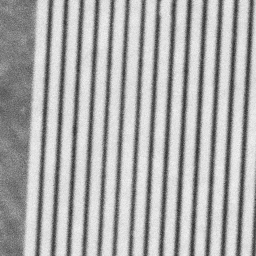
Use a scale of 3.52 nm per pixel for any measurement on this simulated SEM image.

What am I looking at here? parallel lines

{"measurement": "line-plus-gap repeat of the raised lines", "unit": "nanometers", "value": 54.2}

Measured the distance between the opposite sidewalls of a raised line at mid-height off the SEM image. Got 38.6 nm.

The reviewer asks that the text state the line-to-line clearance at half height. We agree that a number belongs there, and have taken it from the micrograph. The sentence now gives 15.8 nm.